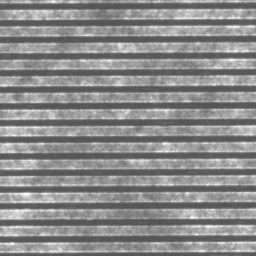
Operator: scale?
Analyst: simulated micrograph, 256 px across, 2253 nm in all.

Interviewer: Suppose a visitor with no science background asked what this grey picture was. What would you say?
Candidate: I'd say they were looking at parallel lines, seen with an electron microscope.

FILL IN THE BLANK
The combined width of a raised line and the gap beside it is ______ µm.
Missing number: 0.146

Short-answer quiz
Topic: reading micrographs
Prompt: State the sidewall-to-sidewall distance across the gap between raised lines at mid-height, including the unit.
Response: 59.4 nanometres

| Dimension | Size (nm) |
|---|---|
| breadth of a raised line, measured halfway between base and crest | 89.1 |